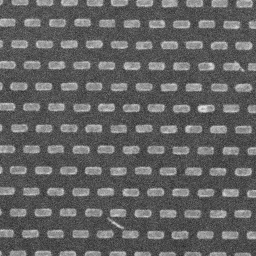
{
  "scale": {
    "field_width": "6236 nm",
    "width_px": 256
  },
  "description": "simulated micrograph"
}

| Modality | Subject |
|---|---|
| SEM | a regular array of raised bodies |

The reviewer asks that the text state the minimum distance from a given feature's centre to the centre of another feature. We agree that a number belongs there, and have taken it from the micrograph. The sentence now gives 590 nanometers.